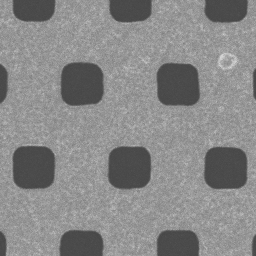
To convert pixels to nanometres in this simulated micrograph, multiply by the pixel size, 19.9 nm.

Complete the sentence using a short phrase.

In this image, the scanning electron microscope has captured holes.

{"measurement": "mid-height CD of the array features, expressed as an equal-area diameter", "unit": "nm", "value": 925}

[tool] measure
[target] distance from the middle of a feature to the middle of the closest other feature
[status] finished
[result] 1910 nanometres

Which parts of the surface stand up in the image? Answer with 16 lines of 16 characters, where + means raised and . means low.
+..++++..++++..+
++++++++++++++++
++++++++++++++++
++++++++++++++++
++++..++++..++++
++++..++++..++++
++++..++++..++++
++++++++++++++++
++++++++++++++++
+..++++..++++..+
+..++++..++++..+
+..++++..++++..+
++++++++++++++++
++++++++++++++++
++++..++++..++++
++++..++++..++++